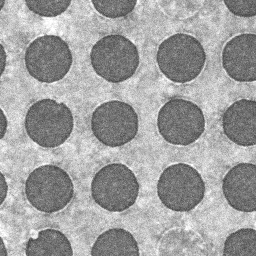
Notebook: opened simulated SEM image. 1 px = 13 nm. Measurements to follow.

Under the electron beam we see a regular array of holes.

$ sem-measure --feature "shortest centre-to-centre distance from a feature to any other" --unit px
64.4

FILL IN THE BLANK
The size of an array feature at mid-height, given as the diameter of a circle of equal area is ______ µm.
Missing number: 0.64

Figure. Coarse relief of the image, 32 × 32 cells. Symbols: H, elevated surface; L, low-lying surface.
LHHLLLLLLHHLLLLLLHHHLLLLLHHHLLLL
HHHHLLLLHHHHLLLLHHHHHHHLHHHHHLLL
HHHHHHHHHHHHHHHHHHHHHHHHHHHHHHHH
HHHHHHHHHHHHHHHHHHHHHHHHHHHHHHHH
HHHHHLLHHHHHHLLLHHHHHLLLHHHHHLLL
HHHHLLLLHHHHLLLLLHHHLLLLLHHHLLLL
LHHLLLLLLHHLLLLLLHHHLLLLLLHHLLLL
LHHLLLLLLHHLLLLLLLHHLLLLLLHHLLLL
LHHLLLLLLHHHLLLLLHHHLLLLLHHHLLLL
HHHHLLLLHHHHLLLLLHHHLLLLLHHHHLLL
HHHHHHHHHHHHHHHHHHHHHHLHHHHHHHHH
HHHHHHHHHHHHHHHHHHHHHHHHHHHHHHHH
HHHHHLLHHHHHHHHHHHHHHLLHHHHHHHLL
HHHHLLLLLHHHLLLLLHHHLLLLLHHHLLLL
LHHLLLLLLHHLLLLLLHHHLLLLLLHHLLLL
LHHLLLLLLHHLLLLLLHHHLLLLLLHHLLLL
LHHLLLLLLHHHLLLLLHHHLLLLLHHHLLLL
HHHHLLLLHHHHLLLLLHHHHLLLLHHHHLLL
HHHHHHLHHHHHHHHHHHHHHHHHHHHHHHHH
HHHHHHHHHHHHHHHHHHHHHHHHHHHHHHHH
HHHHHHHHHHHHHHLHHHHHHHLHHHHHHHLL
HHHHLLLLHHHHLLLLLHHHLLLLLHHHLLLL
LHHLLLLLLHHHLLLLLHHHLLLLLHHHLLLL
LHHLLLLLLHHLLLLLLHHLLLLLLLHHLLLL
LHHLLLLLLHHLLLLLLHHHLLLLLHHHLLLL
HHHHLLLLLHHHLLLLLHHHLLLLLHHHHLLL
HHHHHLLHHHHHHHLHHHHHHHLHHHHHHHHL
HHHHHHHHHHHHHHHHHHHHHHHHHHHHHHHH
HHHHHHHHHHHHHHLHHHHHHHHHHHHHHHLH
HHHHHLLLHHHHLLLLLHHHHHHLHHHHHLLL
LHHLLLLLLHHHLLLLLHHHHHLLLHHHLLLL
LHHLLLLLLHHLLLLLLHHHLLLLLHHHLLLL